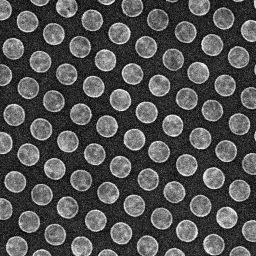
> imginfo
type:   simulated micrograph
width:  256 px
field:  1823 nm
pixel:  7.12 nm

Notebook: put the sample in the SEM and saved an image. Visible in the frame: a regular array of raised bodies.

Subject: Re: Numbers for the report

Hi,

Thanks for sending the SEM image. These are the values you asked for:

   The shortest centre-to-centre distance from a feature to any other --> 205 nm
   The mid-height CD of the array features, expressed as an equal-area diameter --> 149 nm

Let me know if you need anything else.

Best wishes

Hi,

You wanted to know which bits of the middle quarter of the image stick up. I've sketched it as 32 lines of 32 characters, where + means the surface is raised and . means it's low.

++......+++++...+++......+++++..
+++......++....++++........+...+
+++............+++++...........+
+++...+++......+++++..+++......+
++...+++++......+++..+++++......
.....+++++...........+++++......
.....+++++...++.......++++...+++
......+++...++++......+++...++++
............+++++...........++++
............+++++...........++++
...+++......++++...++++......+++
..+++++......++...+++++.........
..+++++...........+++++.........
..+++++..+++.......++++..++++...
...+++..+++++.......++...+++++..
........+++++............+++++..
........+++++....++......+++++..
+++......++++...++++......+++...
+++............+++++............
++++...........+++++...+........
+++...+++.......++++..++++......
+++..+++++...........+++++......
.....+++++...........+++++......
.....+++++...++.......++++...+++
......+++...++++.......++...++++
............+++++...........++++
............+++++...++.......+++
..++++......++++...++++......+++
..+++++............++++.........
..+++++............+++++...+....
..++++...++++......++++..+++++..
...++....++++........+...+++++..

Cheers